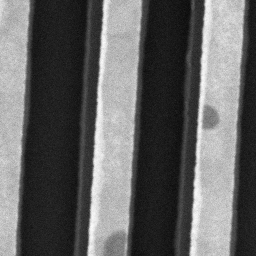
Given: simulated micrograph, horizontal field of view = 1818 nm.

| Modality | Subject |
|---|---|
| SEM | lines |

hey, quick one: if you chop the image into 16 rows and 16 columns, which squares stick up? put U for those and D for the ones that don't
UUDDDDUUUDDDUUUD
UUDDDDUUUDDDUUUD
UUDDDDUUUDDDUUUD
UUDDDUUUUDDDUUUD
UUDDDUUUUDDDUUUD
UUDDDUUUUDDDUUUD
UUDDDUUUDDDDUUUD
UDDDDUUUDDDDUUUD
UDDDDUUUDDDDUUUD
UDDDDUUUDDDDUUUD
UDDDDUUUDDDUUUUD
UDDDDUUUDDDUUUUD
UDDDDUUUDDDUUUUD
UDDDDUUUDDDUUUUD
UDDDDUUUDDDUUUDD
UDDDDUUUDDDUUUDD